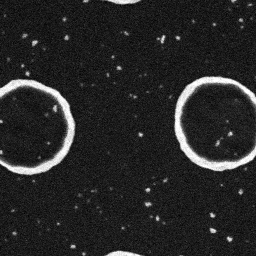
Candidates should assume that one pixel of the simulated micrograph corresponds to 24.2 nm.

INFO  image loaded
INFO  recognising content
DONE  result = raised bodies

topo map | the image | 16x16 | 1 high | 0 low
0000000000000000
0000000000000000
0000000000000000
0000000000000000
0000000000000000
1110000000001110
1111000000011111
1111000000011111
1111000000011111
1111000000001111
0110000000000000
0000000000000000
0000000000000000
0000000000000000
0000000000000000
0000000000000000